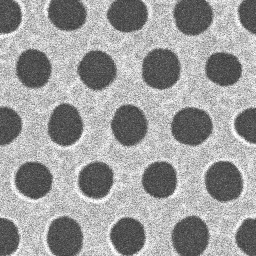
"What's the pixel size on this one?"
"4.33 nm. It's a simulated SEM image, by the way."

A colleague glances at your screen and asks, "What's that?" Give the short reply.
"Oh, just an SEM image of a regular array of holes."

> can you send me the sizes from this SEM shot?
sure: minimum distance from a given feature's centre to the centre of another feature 0.272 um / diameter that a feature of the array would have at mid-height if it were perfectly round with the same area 166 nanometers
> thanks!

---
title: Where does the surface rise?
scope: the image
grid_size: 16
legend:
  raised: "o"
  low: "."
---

.oo..oo..oo..oo.
.oo..oo..oo..oo.
oooooooooooooooo
o..oo..oo..oo..o
o..oo..oo..oo..o
oooooooooooooooo
oooooooooooooooo
.oo..oo..oo..oo.
.oo..oo..oo..oo.
oooooooooooooooo
o..oo..oo..oo..o
o..oo..oo..oo..o
oooooooooooooooo
oooooooooooooooo
.oo..oo..oo..oo.
.oo..oo..oo..oo.